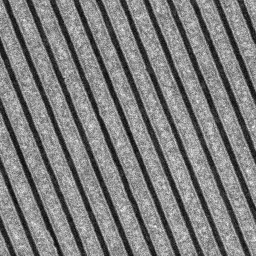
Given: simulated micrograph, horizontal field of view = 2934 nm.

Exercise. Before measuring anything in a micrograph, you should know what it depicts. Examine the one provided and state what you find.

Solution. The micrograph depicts parallel lines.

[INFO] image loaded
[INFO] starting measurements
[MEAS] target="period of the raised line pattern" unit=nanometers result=250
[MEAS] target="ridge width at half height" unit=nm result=177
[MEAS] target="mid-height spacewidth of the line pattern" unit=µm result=0.0785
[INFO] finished